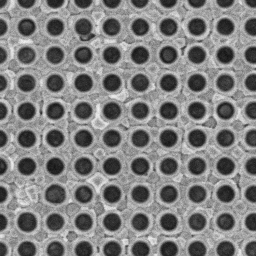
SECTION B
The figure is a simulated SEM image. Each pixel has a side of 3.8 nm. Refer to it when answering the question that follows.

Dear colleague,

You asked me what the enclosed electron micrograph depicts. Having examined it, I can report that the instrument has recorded a regular array of holes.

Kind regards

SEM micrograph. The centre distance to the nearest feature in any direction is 105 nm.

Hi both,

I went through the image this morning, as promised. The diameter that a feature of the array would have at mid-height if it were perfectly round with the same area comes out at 70.1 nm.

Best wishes